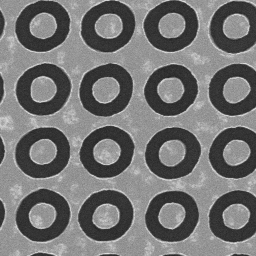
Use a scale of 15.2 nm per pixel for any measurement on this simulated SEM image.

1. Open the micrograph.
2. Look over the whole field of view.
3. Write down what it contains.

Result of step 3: a regular array of ring-shaped grooves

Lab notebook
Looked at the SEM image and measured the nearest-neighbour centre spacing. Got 958 nanometers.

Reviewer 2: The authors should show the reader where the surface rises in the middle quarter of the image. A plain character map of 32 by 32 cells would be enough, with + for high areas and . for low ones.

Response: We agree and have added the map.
+++++++++.....++++++++++++...+++
+++++++.........+++++++........+
.++++...........++++++..........
.++++....+++.....++++...........
..++....+++++....++++...+++++...
..++...+++++++...+++....++++++..
..++...+++++++...+++...+++++++..
.+++...+++++++...+++....++++++..
.+++....+++++....+++....+++++...
.+++.....++.....+++++....+++....
+++++...........+++++..........+
++++++.........+++++++.........+
+++++++......+++++++++++.....+++
++++++++++++++++++++++++++++++++
++++++++++++++++++++++++++++++++
+++++++++++.++++++++++++++++++++
++++++++.......++++++++++......+
++++++..........+++++++.........
.++++............+++++..........
.++++....++++....++++.....+++...
.+++....++++++....+++...++++++..
..++...+++++++....+++...++++++..
..++...+++++++...+++....++++++..
.+++....++++++...+++....++++++..
.+++....+++++....++++...+++++...
.++++...........+++++.....+.....
++++++.........++++++...........
+++++++.......+++++++++........+
+++++++++..+++++++++++++.....+++
++++++++++++++++++++++++++++++++
++++++++++++++++++++++++++++++++
++++++++++..++++++++++++++++++++